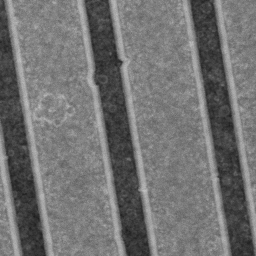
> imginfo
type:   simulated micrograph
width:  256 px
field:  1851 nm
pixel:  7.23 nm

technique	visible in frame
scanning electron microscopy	one or a few lines or trenches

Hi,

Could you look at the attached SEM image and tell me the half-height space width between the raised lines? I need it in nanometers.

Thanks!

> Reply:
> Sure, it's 241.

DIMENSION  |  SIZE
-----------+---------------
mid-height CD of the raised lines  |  0.499 microns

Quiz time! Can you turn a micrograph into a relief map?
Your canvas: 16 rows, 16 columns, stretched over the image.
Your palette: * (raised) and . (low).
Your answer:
.****..*****..**
.****..*****..**
.****...****..**
.*****..****..**
.*****..****..**
.*****..****...*
..****..*****..*
..****..*****..*
..****...****..*
..*****..****..*
..*****..****..*
..*****..****...
*..****..*****..
*..****..*****..
*..****..*****..
*..****...****..